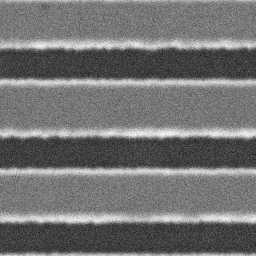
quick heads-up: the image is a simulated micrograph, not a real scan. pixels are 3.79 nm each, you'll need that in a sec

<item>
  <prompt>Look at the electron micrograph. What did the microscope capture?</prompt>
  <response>lines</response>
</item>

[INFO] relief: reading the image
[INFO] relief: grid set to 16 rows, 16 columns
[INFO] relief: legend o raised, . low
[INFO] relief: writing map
oooooooooooooooo
oooooooooooooooo
oooooooooooooooo
................
................
oooooooooooooooo
oooooooooooooooo
oooooooooooooooo
ooo.o....oo...o.
................
................
oooooooooooooooo
oooooooooooooooo
oooooooooooooooo
................
................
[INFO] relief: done